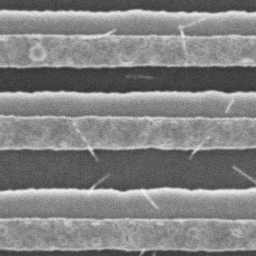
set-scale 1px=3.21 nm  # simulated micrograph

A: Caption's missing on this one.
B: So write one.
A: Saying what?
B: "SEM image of lines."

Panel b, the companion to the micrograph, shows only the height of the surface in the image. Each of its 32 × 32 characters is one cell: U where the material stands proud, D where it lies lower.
DDDDDDDDDDDDDDDDDDDDDDDDDDDDDDDD
UUUUUUDUUDDDDDUDUUUDUDDDDDDDDDDD
UUUUUUUUUUUUUUUUUUUUUUUUUUUUUUUU
UUUUUUUUUUUUUUUUUUUUUUUUUUUUUUUU
UUUUUUUUUUUUUUUUUUUUUUUUUUUUUUUU
UUUUUUUUUUUUUUUUUUUUUUUUUUUUUUUU
UUUUUUUUUUUUUUUUUUUUUUUUUUUUUUUU
UUUUUUUUUUUUUUUUUUUUUUUUUUUUUUUU
DDDDDDDDDDDDDDDDDDDDDDDDDDDDDDDD
DDDDDDDDDDDDDDDDDDDDDDDDDDDDDDDD
DDDDDDDDDDDDDDDDDDDDDDDDDDDDDDDD
DDDDDDDUDDDDDDDDDDDUDUDDDDUDDDDD
UUUUUUUUUUUUUUUUUUUUUUUUUUUUUUUU
UUUUUUUUUUUUUUUUUUUUUUUUUUUUUUUU
UUUUUUUUUUUUUUUUUUUUUUUUUUUUUUUU
UUUUUUUUUUUUUUUUUUUUUUUUUUUUUUUU
UUUUUUUUUUUUUUUUUUUUUUUUUUUUUUUU
UUUUUUUUUUUUUUUUUUUUUUUUUUUUUUUU
UUUUUUUUUUUUUUUUUDDDUUUUUUUUUUUD
DDDDDDDDDDDDDDDDDDDDDDDDDDDDDDDD
DDDDDDDDDDDDDDDDDDDDDDDDDDDDDDDD
DDDDDDDDDDDDDDDDDDDDDDDDDDDDDDDD
DDDDDDDDDDDDDDDDDDDDDDDDDDDDDDDD
DDDDDDDDDDDDDDDDDDDDUDDDDDDDDDDD
UUUUUUUUUUUUUUUUUUUUUUUUUUUUUUUU
UUUUUUUUUUUUUUUUUUUUUUUUUUUUUUUU
UUUUUUUUUUUUUUUUUUUUUUUUUUUUUUUU
UUUUUUUUUUUUUUUUUUUUUUUUUUUUUUUU
UUUUUUUUUUUUUUUUUUUUUUUUUUUUUUUU
UUUUUUUUUUUUUUUUUUUUUUUUUUUUUUUU
UUUUUUUUUUUUUUUUUUUUUUUUUUUUUUUU
DDDDDDDDDDDDDDDDDDDDDDDDDDDDDDDD